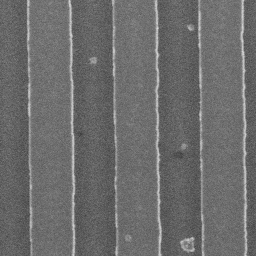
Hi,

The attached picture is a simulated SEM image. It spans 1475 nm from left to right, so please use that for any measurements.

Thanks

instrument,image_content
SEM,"lines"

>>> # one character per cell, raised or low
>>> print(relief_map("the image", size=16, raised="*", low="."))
..**...***..***.
..**...***..***.
..**...***..***.
..**...***...**.
..**...***...**.
..***..***...**.
..***..***...**.
..***..***...**.
..***..***...**.
..***..***...**.
..***..***...**.
..***..***...**.
..***..***...**.
..***..***...**.
..***..***...**.
..***..***...**.